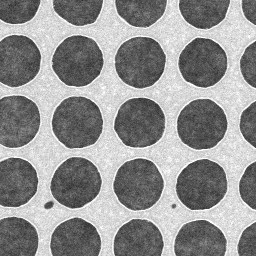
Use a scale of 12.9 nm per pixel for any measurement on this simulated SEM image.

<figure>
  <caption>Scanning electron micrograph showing a regular array of holes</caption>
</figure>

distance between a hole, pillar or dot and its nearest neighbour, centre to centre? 783 nm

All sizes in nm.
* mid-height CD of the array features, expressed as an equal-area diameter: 661